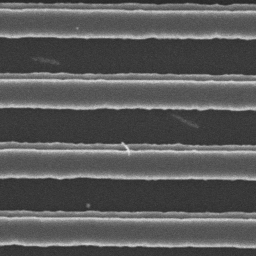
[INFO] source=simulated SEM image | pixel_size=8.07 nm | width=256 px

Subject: lines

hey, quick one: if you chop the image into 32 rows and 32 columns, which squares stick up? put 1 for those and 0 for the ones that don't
11111101101000011000000100000000
11111111111111111111111111111111
11111111111111111111111111111111
11111111111111111111111111111111
11111111111111111111111111111111
00000000000000000000000000000000
00000000000000000000000000000000
00000000000000000000000000000000
00000000000000000000000000000000
11111111111111111111111111111111
11111111111111111111111111111111
11111111111111111111111111111111
11111111111111111111111111111111
00000111111111111111111111111111
00000000000000000000000000000000
00000000000000000000000000000000
00000000000000000000000000000000
00000000000000000000000000000000
11111111111111111111111111111111
11111111111111111111111111111111
11111111111111111111111111111111
11111111111111111111111111111111
00000000000000000000000000000000
00000000000000000000000000000000
00000000000000000000000000000000
00000000000000000000000000000000
11110001001100000000000000000000
11111111111111111111111111111111
11111111111111111111111111111111
11111111111111111111111111111111
11111111111111111111111111111111
00000000000000000000000000000000